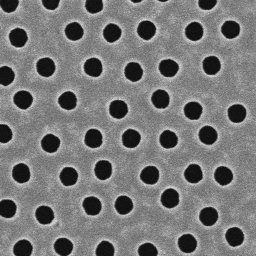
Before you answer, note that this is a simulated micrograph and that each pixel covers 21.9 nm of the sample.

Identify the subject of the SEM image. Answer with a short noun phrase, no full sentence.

a regular array of holes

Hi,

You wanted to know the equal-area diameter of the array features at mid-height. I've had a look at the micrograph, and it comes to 429 nm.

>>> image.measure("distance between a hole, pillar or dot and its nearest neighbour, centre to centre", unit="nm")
763